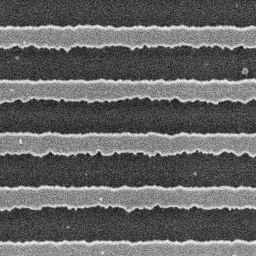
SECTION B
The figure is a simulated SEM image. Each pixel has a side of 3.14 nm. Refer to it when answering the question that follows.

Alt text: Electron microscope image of lines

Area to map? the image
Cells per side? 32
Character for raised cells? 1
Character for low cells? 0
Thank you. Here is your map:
00000000000000000000000000000000
00000000000000000000000000000000
00000000000000000000000000000000
11111111111111111111111111111111
11111111111111111111111111111111
11111111111111111111111111111111
00000000000000000000000000000000
00000000000000000000000000000000
00000000000000000000000000000000
00000000000000000000000000000000
11111111111111111111111111111111
11111111111111111111111111111111
11110001111111100000001111110110
00000000000000000000000000000000
00000000000000000000000000000000
00000000000000000000000000000000
00000000000000000000000000000000
11111111111111111111111111111111
11111111111111111111111111111111
00000000000000000000000000000001
00000000000000000000000000000000
00000000000000000000000000000000
00000000000000000000000000000000
11111111111111011111111111111111
11111111111111111111111111111111
11111111111111111111111111111111
00000000000000000000000000000000
00000000000000000000000000000000
00000000000000000000000000000000
00000000000000000000000000000000
11111111111111111111111111111111
11111111111111111111111111111111